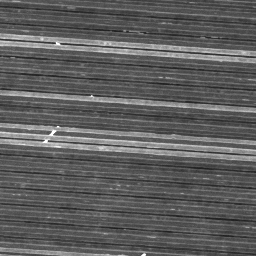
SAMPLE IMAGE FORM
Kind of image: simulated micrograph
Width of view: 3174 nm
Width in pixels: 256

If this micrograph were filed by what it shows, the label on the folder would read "parallel lines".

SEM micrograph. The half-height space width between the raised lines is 47.9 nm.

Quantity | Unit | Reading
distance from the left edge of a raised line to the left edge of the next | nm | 102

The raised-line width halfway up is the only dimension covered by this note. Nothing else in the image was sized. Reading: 4.86 pixels